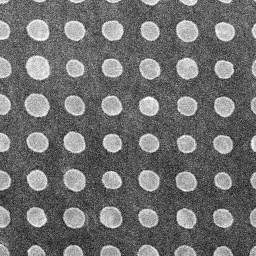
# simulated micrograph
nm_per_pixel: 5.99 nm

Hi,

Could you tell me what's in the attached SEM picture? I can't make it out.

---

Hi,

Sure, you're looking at a regular array of raised bodies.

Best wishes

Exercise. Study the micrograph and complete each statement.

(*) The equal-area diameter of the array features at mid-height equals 19.4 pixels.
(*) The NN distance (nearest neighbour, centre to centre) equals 221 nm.